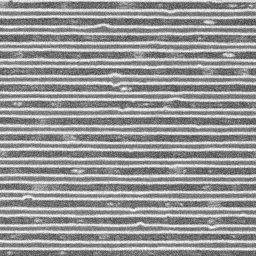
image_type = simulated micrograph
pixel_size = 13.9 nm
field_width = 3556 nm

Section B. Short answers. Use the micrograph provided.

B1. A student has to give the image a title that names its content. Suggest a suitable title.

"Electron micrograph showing parallel lines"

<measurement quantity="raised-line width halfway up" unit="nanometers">93.8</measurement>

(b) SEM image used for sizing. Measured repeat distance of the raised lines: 230 nm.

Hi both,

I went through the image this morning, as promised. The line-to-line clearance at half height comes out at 134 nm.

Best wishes